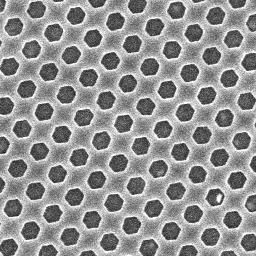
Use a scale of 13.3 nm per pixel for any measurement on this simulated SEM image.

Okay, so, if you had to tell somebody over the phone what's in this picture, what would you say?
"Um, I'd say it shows a regular array of holes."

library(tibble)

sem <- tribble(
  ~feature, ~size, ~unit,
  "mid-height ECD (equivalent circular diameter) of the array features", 250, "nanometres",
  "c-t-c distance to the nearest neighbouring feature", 27.7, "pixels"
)